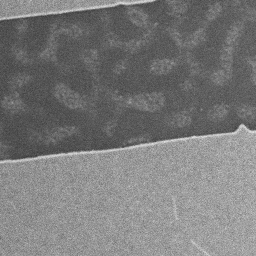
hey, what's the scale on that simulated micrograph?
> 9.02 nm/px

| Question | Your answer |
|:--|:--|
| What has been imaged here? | one or a few lines or trenches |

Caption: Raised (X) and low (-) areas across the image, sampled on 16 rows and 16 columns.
XXXXXX----------
----------------
----------------
----------------
----------------
----------------
----------------
----------------
-------------XXX
-----XXXXXXXXXXX
XXXXXXXXXXXXXXXX
XXXXXXXXXXXXXXXX
XXXXXXXXXXXXXXXX
XXXXXXXXXXXXXXXX
XXXXXXXXXXXXXXXX
XXXXXXXXXXXXXXXX